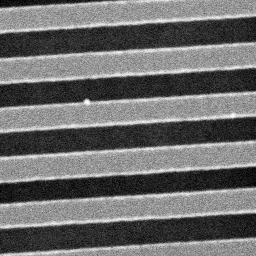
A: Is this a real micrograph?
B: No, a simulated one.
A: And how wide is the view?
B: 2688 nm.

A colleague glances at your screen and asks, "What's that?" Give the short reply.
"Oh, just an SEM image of lines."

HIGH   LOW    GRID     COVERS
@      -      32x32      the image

----------@@@@@@@@@@@@@@@@@@@@@@
@@@@@@@@@@@@@@@@@@@@@@@@@@@@@@@@
@@@@@@@@@@@@@@@@@@@@@@@@--------
@@@@@@@@@@----------------------
--------------------------------
------------------------------@@
---------------@@@@@@@@@@@@@@@@@
@@@@@@@@@@@@@@@@@@@@@@@@@@@@@@@@
@@@@@@@@@@@@@@@@@@@@@@@@@@@@@@@-
@@@@@@@@@@@@@@------------------
--------------------------------
--------------------------------
----------------@@@@@@@@@@@@@@@@
-@@@@@@@@@@@@@@@@@@@@@@@@@@@@@@@
@@@@@@@@@@@@@@@@@@@@@@@@@@@@@@@@
@@@@@@@@@@@@@@@@----------------
@-------------------------------
--------------------------------
-------------------@@@@@@@@@@@@@
----@@@@@@@@@@@@@@@@@@@@@@@@@@@@
@@@@@@@@@@@@@@@@@@@@@@@@@@@@@@@@
@@@@@@@@@@@@@@@@@@@@@-----------
@@@@@---------------------------
--------------------------------
-----------------@@@@@@@@@@@@@@@
@@@@@@@@@@@@@@@@@@@@@@@@@@@@@@@@
@@@@@@@@@@@@@@@@@@@@@@@@@@@@@@@@
@@@@@@@@@@@@@@@@@---------------
--------------------------------
--------------------------------
---------------------@@@@@@@@@@@
-----@@@@@@@@@@@@@@@@@@@@@@@@@@@